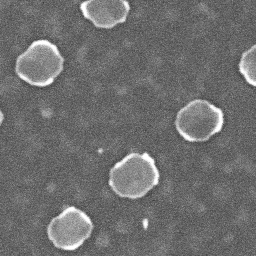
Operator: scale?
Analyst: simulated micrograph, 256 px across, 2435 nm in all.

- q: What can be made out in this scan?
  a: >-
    raised bodies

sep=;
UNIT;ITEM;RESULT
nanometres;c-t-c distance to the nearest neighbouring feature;801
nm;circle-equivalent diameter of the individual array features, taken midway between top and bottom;409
